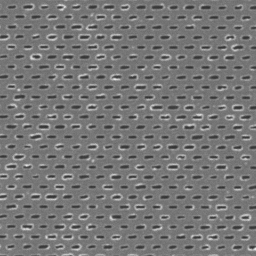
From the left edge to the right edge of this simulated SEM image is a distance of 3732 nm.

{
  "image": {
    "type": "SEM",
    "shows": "a regular array of holes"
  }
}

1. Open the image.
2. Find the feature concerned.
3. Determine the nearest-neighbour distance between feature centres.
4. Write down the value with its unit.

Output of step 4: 181 nanometers